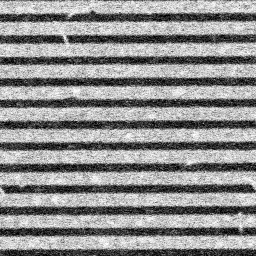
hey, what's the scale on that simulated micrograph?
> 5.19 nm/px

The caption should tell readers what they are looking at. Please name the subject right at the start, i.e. parallel lines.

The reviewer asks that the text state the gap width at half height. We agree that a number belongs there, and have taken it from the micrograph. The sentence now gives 46.7 nanometres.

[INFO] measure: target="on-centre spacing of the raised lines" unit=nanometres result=111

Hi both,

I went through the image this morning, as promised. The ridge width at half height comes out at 0.0623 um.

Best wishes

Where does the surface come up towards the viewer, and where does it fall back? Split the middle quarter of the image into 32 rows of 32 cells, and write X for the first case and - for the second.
XXXXXXXXXXXXXXXXXXXXXXXXXXXXXXXX
XXXXXXXXXXXXXXXXXXXXXXXXXXXXXXXX
XXXXXXXXXXXXXXXXXXXXXXXXXXXXXXXX
--------------------------------
--------------------------------
--------------------------------
XXXXXXXXXXXXXXXXXXXXXXXXXXXXXXXX
XXXXXXXXXXXXXXXXXXXXXXXXXXXXXXXX
---XXXXXXXXXXXXXXXXXXXXXXXXXXXXX
--------------------------------
--------------------------------
XXXXXXXXXXXXXXXXXXXXXXXXXXXXXXXX
XXXXXXXXXXXXXXXXXXXXXXXXXXXXXXXX
XXXXXXXXXXXXXXXXXXXXXXXXXXXXXXXX
--------------------------------
--------------------------------
---------------------------X-X--
XXXXXXXXXXXXXXXXXXXXXXXXXXXXXXXX
XXXXXXXXXXXXXXXXXXXXXXXXXXXXXXXX
--------------------------------
--------------------------------
--------------------------------
XXXXXXXXXXXXXXXXXXXXXXXXXXXXXXXX
XXXXXXXXXXXXXXXXXXXXXXXXXXXXXXXX
XXXXXXXXXXXXXXXXXXXXXXXXXXXXX-XX
--------------------------------
--------------------------------
XXXXXXXXXXXXXXXXXXXXXXXXXXXXXXXX
XXXXXXXXXXXXXXXXXXXXXXXXXXXXXXXX
XXXXXXXXXXXXXXXXXXXXXXXXXXXXXXXX
--------------------------------
--------------------------------